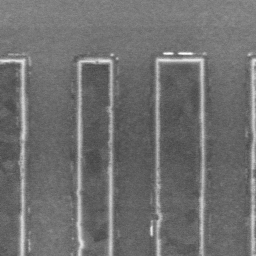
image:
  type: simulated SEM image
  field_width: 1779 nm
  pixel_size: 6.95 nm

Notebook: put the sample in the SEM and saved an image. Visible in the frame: one or a few lines or trenches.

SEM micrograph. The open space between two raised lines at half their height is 0.356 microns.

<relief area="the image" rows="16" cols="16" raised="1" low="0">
0000000000000000
0000000000000000
0000000000000000
0000000000000000
1000011000111000
1000011000111000
1000011000111000
1000011000111000
1000011000111000
1000011000111000
1000011000111000
1000011000111000
1000011000111000
1000011000111000
1000011000111000
1000011000111000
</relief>